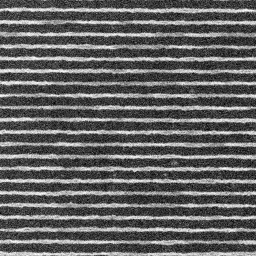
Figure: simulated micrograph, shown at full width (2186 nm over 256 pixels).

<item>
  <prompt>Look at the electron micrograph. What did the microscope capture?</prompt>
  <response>parallel lines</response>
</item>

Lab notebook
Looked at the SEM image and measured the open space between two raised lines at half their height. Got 0.079 µm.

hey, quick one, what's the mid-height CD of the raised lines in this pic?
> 23.5 nanometres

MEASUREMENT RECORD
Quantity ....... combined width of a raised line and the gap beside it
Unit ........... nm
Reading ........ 104